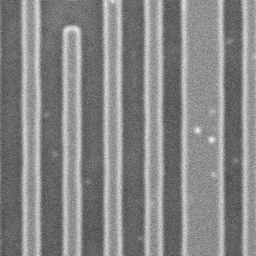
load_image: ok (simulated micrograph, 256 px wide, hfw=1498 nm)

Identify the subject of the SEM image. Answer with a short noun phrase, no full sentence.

groups of lines, slits or small figures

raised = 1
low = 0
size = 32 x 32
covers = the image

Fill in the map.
00011000000001100011000111110001
00011000000001100011000111110001
00011000000001100011000111110001
00011000000001100011000111110001
00011000110001100011000111110001
00011000110001100011000111110001
00011000110001100011000111110001
00011000110001100011000111110001
00011000110001100011000111110001
00011000110001100011000111110001
00011000110001100011000111110001
00011000110001100011000111110001
00011000110001100011000111110001
00011000110001100011000111110001
00011000110001100011000111110001
00011000110001100011000111110001
00011000110001100011000111110001
00011000110001100011000111110001
00011000110001100011000111110001
00011000110001100011000111110001
00011000110001100011000111110001
00011000110001100011000111110001
00011000110001100011000111110001
00011000110001100011000111110001
00011000110001100011000111110001
00011000110001100011000111110001
00011000110001100011000111110001
00011000110001100011000111110001
00011000110001100011000111110001
00011000110001100011000111110001
00011000110001100011000111110001
00011000110001100011000111110001